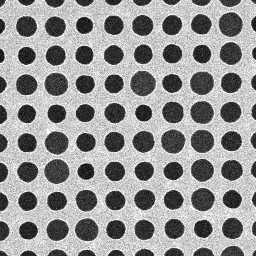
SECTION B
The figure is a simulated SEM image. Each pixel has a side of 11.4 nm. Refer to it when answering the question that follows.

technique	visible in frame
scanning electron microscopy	a regular array of holes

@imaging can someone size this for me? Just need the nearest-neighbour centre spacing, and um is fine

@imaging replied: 0.33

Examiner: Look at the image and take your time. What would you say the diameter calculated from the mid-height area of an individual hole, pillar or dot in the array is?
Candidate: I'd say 234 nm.